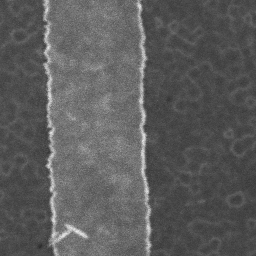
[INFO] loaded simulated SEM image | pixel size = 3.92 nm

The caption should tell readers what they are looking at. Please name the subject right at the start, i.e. one or a few lines or trenches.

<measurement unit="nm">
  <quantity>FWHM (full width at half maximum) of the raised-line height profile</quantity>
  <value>371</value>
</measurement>